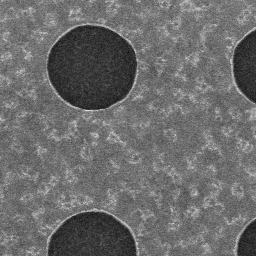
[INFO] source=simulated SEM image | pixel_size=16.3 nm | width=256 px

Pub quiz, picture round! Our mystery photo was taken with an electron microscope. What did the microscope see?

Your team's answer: holes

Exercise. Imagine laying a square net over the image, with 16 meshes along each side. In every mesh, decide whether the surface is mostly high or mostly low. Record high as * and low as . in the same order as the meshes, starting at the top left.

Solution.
****************
****************
****....*******.
***.....*******.
***......******.
***.....*******.
****...*********
****************
****************
****************
****************
****************
****************
*****..*********
***.....*******.
***......******.